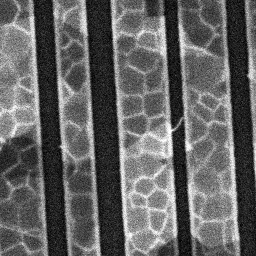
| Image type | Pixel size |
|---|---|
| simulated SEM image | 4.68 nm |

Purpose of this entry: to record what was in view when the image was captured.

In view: one or a few lines or trenches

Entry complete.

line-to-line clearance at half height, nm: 108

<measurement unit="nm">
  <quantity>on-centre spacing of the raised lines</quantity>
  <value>308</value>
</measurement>